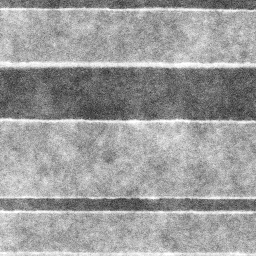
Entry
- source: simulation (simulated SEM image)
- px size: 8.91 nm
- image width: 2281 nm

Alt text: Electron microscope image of lines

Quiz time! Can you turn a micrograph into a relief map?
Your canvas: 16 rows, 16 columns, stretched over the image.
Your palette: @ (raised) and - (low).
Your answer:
@@@@@@@@@@@@@@@@
@@@@@@@@@@@@@@@@
@@@@@@@@@@@@@@@@
@@@@@@@@@@@@@@@@
----------------
----------------
----------------
----------------
@@@@@@@@@@@@@@@@
@@@@@@@@@@@@@@@@
@@@@@@@@@@@@@@@@
@@@@@@@@@@@@@@@@
@@@@@@@@@@@@@@@@
@@@@@@@@@@@@@@@@
@@@@@@@@@@@@@@@@
@@@@@@@@@@@@@@@@